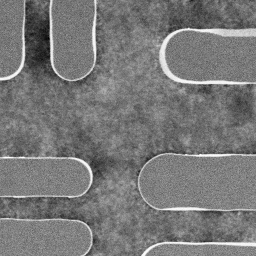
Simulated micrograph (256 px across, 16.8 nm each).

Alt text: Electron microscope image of groups of lines, slits or small figures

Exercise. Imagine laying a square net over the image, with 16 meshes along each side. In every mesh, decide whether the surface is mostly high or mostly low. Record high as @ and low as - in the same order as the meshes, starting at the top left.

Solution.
@@-@@@----------
@--@@@----------
@--@@@----@@@@@@
@--@@@----@@@@@@
@---@@-----@@@@@
----------------
----------------
----------------
----------------
----------------
@@@@@----@@@@@@@
@@@@@@---@@@@@@@
---------@@@@@@@
----------------
@@@@@@----------
@@@@@@---@@@@@@@